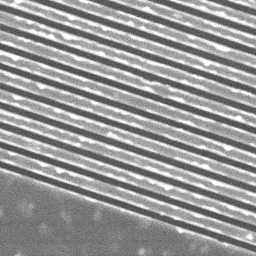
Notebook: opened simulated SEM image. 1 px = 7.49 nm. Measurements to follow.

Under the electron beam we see parallel lines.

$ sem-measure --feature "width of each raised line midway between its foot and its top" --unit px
12.2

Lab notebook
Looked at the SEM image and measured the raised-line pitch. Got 140 nanometers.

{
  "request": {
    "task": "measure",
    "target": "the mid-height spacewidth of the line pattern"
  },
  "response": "49.7 nm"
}